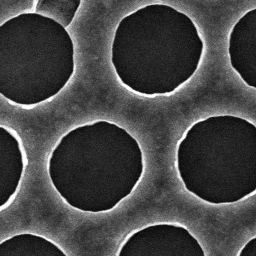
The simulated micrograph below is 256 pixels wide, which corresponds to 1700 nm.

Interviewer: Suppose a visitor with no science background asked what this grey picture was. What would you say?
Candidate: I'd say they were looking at holes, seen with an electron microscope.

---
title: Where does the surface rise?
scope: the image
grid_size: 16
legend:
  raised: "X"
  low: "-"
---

XXXXXXXXX--XXXXX
----XXX-----XXX-
----XXX------X--
-----XX------X--
-----XX-----XXX-
----XXXX---XXXXX
X-XXXXXXXXXXXXXX
XXXXXXXXXXXXX--X
-XXX----XXXX----
-XX------XX-----
-XX------XX-----
-XX-----XXXX----
XXXX----XXXXX--X
XXXXXXXXXXXXXXXX
XXXXXXXXX---XXXX
----XXXX-----XX-